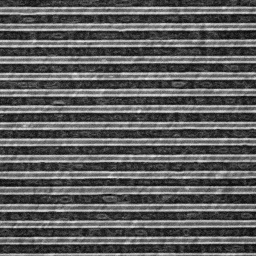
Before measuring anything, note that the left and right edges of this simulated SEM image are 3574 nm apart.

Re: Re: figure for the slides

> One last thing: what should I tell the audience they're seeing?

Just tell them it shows parallel lines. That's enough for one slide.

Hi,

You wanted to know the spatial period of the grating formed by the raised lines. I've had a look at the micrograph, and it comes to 229 nm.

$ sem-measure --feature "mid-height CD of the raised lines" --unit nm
94.2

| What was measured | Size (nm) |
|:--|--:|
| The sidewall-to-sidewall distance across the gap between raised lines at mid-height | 136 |